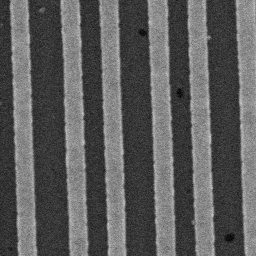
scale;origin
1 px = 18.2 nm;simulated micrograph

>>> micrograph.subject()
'lines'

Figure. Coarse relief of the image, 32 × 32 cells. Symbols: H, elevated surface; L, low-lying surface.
LHHLLLLLHHLLLHHLLLLHHLLLHHLLLLHH
LHHLLLLLHHLLLHHLLLLHHLLLHHLLLLHH
LLHLLLLLHHLLLHHLLLLHHLLLHHLLLLHH
LLHHLLLLHHLLLHHLLLLHHLLLHHLLLLHH
LLHHLLLLHHLLLHHLLLLHHLLLHHLLLLHH
LLHHLLLLHHLLLHHLLLLHHLLLHHLLLLHH
LLHHLLLLHHLLLHHLLLLHHLLLHHLLLLHH
LLHHLLLLHHLLLHHLLLLHHLLLHHLLLLHH
LLHHLLLLHHLLLHHLLLLHHLLLHHLLLLHH
LLHHLLLLHHLLLHHLLLLHHLLLHHLLLLHH
LLHHLLLLHHLLLHHLLLLHHLLLHHLLLLHH
LLHHLLLLHHLLLHHLLLLHHLLLHHLLLLHH
LLHHLLLLHHLLLHHLLLLHHLLLHHLLLLHH
LLHHLLLLHHLLLHHLLLLHHLLLHHLLLLHH
LLHHLLLLHHLLLHHLLLLHHLLLHHLLLLHH
LLHHLLLLHHLLLHHLLLLHHLLLHHLLLLHH
LLHHLLLLHHLLLHHLLLLHHLLLHHLLLLHH
LLHHLLLLHHLLLHHLLLLHHLLLHHLLLLHH
LLHHLLLLHHLLLHHLLLLHHLLLHHLLLLHH
LLHHLLLLHHHLLHHLLLLHHLLLHHLLLLHH
LLHHLLLLHHHLLHHLLLLHHLLLHHLLLLHH
LLHHLLLLHHHLLHHLLLLHHLLLHHLLLLHH
LLHHLLLLLHHLLHHLLLLHHLLLHHLLLLHH
LLHHLLLLLHHLLHHLLLLHHHLLHHLLLLHH
LLHHLLLLLHHLLHHLLLLHHHLLHHLLLLHH
LLHHLLLLLHHLLHHLLLLHHHLLHHHLLLLH
LLHHLLLLLHHLLLHLLLLLHHLLHHHLLLLH
LLHHLLLLLHHLLLHLLLLLHHLLLHHLLLLH
LLHHLLLLLHHLLLHHLLLLHHLLLHHLLLLH
LLHHLLLLLHHLLLHHLLLLHHLLLHHLLLLH
LLHHLLLLLHHLLLHHLLLLHHLLLHHLLLLH
LLHHLLLLLHHLLLHHLLLLHHLLLHHLLLLH